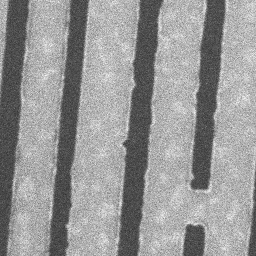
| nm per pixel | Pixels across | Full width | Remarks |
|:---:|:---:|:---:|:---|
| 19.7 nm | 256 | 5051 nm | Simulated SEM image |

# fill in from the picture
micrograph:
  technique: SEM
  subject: one or a few lines or trenches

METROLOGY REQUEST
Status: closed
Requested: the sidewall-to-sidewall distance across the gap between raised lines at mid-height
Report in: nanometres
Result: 818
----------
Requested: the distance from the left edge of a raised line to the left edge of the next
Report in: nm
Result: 1330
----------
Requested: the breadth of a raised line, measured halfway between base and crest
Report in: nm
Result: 458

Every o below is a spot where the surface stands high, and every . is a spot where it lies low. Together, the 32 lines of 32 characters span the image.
.ooo.....oo......ooo......oo....
.ooo.....oo......ooo......oo....
.ooo....ooo......ooo.....ooo....
.ooo....ooo......ooo.....ooo....
.oo.....ooo......ooo.....ooo....
ooo.....ooo......ooo.....ooo....
ooo.....ooo......ooo.....ooo....
ooo.....ooo.....oooo.....ooo....
ooo.....oo......oooo.....ooo....
ooo.....oo......ooo......ooo....
ooo.....oo.......oo......ooo....
ooo.....oo......ooo.....ooo.....
ooo.....oo......ooo.....ooo.....
ooo....ooo......ooo.....ooo.....
ooo....ooo......ooo.....ooo.....
ooo....ooo......ooo.....ooo.....
ooo....ooo......ooo.....ooo.....
oo.....ooo.....oooo.....ooo.....
oo.....ooo.....oooo.....ooo.....
oo.....oo.......ooo.....ooo.....
oo.....oo......oooo.....ooo.....
oo.....oo......ooo......oo......
oo.....oo......ooo......oo......
oo.....oo......ooo......oo......
oo....ooo......ooo.............o
oo....ooo......ooo.............o
oo....ooo......ooo.............o
o.....ooo......ooo.............o
o.....ooo......ooo.....ooo.....o
o.....ooo......ooo.....ooo.....o
o.....ooo......ooo.....ooo.....o
o.....oo.......ooo.....ooo.....o